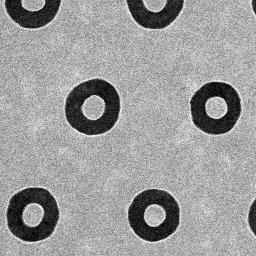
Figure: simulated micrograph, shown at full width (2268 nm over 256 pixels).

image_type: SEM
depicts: ring-shaped grooves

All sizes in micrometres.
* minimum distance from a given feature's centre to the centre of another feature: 1.08